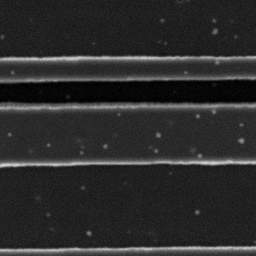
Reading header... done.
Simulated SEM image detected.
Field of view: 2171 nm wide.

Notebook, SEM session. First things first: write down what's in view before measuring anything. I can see lines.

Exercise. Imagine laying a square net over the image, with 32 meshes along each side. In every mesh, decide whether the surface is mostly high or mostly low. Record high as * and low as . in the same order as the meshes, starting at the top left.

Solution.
................................
................................
................................
................................
................................
................................
................................
********************************
********************************
********************************
................................
................................
................................
********************************
********************************
********************************
********************************
********************************
********************************
********************************
***.............................
................................
................................
................................
................................
................................
................................
................................
................................
................................
................................
********************************